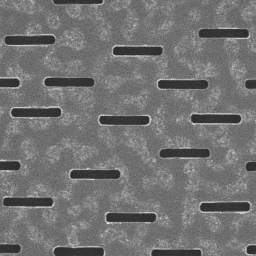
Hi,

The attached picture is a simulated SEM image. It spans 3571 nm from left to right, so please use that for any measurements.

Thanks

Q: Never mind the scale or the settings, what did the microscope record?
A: a regular array of holes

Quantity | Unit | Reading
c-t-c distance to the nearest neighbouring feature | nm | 780